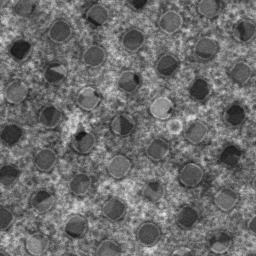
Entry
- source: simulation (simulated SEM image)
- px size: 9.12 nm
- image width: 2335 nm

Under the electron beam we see a regular array of raised bodies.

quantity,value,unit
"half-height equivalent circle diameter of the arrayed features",197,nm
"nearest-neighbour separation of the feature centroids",41.5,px